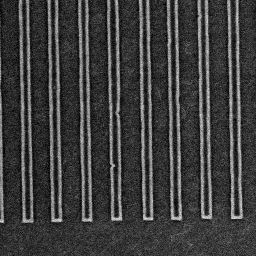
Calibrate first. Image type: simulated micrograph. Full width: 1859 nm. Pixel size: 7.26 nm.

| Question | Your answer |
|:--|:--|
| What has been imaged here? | parallel lines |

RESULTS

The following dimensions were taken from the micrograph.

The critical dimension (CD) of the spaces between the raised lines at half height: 159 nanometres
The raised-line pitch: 217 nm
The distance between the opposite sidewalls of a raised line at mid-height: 55.4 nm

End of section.